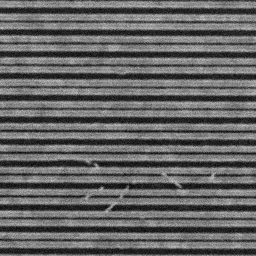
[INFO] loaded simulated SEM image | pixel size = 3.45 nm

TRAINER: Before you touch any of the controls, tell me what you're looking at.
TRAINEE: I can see parallel lines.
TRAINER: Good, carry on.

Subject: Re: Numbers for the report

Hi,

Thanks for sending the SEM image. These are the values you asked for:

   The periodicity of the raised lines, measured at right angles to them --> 0.0377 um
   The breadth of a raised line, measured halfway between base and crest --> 0.0189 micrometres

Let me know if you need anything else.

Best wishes